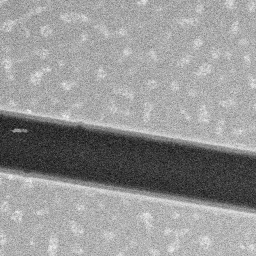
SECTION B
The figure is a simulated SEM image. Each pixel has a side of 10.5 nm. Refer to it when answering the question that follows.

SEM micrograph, one or a few lines or trenches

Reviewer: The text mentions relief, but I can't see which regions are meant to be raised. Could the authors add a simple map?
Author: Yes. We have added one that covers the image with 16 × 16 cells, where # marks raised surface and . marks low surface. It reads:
################
################
################
################
################
################
################
...#############
..........######
................
................
#####...........
###########.....
################
################
################